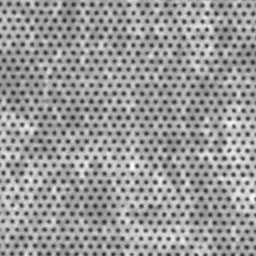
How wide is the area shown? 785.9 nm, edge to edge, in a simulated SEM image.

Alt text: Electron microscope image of a regular array of holes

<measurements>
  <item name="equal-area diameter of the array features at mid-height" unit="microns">0.0155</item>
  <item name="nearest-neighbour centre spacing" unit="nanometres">27.7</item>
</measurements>